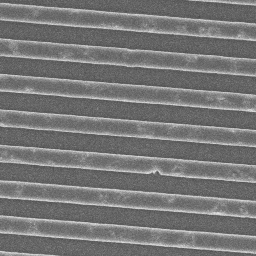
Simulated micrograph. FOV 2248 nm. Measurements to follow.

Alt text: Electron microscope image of parallel lines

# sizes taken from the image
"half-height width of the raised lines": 148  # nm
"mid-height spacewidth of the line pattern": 0.163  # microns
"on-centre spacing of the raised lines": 0.31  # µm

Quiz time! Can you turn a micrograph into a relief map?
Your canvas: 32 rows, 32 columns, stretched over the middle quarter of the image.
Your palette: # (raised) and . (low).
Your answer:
...............#################
.............................###
................................
................................
######.#........................
#####################...........
################################
################################
......##########################
..................##############
..............................##
................................
................................
##########......................
####################............
################################
################################
.......#########################
....................#.##########
................................
................................
................................
############....................
########################........
################################
################################
...........#####################
........................########
................................
................................
#...............................
#############...................